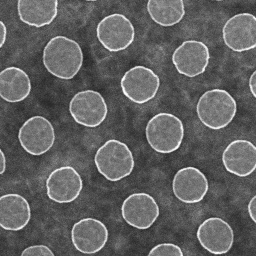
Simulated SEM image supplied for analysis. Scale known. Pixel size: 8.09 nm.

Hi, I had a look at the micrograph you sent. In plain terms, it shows a regular array of raised bodies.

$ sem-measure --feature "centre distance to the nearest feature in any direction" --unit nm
456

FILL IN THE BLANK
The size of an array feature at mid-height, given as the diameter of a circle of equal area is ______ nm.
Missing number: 288